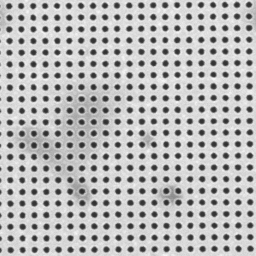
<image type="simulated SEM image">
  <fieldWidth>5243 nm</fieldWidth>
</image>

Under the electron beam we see a regular array of holes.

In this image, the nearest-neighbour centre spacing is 235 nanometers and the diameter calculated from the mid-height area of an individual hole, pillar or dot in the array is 139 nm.